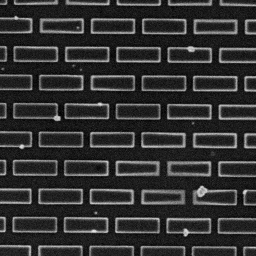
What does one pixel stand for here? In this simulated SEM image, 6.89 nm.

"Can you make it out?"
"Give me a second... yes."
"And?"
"groups of lines, slits or small figures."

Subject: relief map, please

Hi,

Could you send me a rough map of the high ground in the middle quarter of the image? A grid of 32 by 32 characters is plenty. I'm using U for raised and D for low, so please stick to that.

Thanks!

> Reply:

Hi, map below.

DDDDDDDDDDDDDDDDDDDDDDDDDDDDDDDD
DDDDDDDDDDDDDDDDDDDDDDDDDDDDDDDD
DDDDDDDDDDDDDDDDDDDDDDDDDDDDDDDD
UUUUUDDUUUUUUUUUUUDDUUUUUUUUUUDD
UUUUUDDUUUUUUUUUUUDDUUUUUUUUUUDD
UUUUUDDUUUUUUUUUUUDDUUUUUUUUUUDD
DDDDDDDDDDDDDDDDDDDDUUUUUUUUUUDD
DDDDDDDDDDDDDDDDDDDDDDDDDDDDDDDD
DDDDDDDDDDDDDDDDDDDDDDDDDDDDDDDD
DDDDDDDDDDDDDDDDDDDDDDDDDDDDDDDD
UUUUUUUUUUUDDUUUUUUUUUUUDDUUUUUU
UUUUUUUUUUUDDUUUUUUUUUUUDDUUUUUU
UUUUUUUUUUUDDUUUUUUUUUUUDDUUUUUU
DUUUUUUUUUUDDUUUUUUUUUUUDDUUUUUU
DDDDDDDDDDDDDDDDDDDDDDDDDDDDDDDD
DDDDDDDDDDDDDDDDDDDDDDDDDDDDDDDD
DDDDDDDDDDDDDDDDDDDDDDDDDDDDDDDD
UUUUUDDUUUUUUUUUUUDDUUUUUUUUUUDD
UUUUUDDUUUUUUUUUUDDDUUUUUUUUUUDD
UUUUUDDUUUUUUUUUUDDDUUUUUUUUUUDD
UUUUUDDUUUUUUUUUUDDDUUUUUUUUUUDD
DDDDDDDDDDDDDDDDDDDDDDDDDDDDDDDD
DDDDDDDDDDDDDDDDDDDDDDDDDDDDDDDD
DDDDDDDDDDDDDDDDDDDDDDDDDDDDDDDD
UUUUUUUUUUUDDUDDDDDDDDDDDDDDDDDD
UUUUUUUUUUUDDUUUUUUUUUUUDDUUUUUU
UUUUUUUUUUUDDUUUUUUUUUUDDDUUUUUU
UUUUUUUUUUUDDUUUUDDDDDDDDDDDDDDD
DDDDDDDDDDDDDDDDDDDDDDDDDDDDDDDD
DDDDDDDDDDDDDDDDDDDDDDDDDDDDDDDD
DDDDDDDDDDDDDDDDDDDDDDDDDDDDDDDD
UUUUDDDDDDDDDDDDDDDDDDDDDDDDDDDD